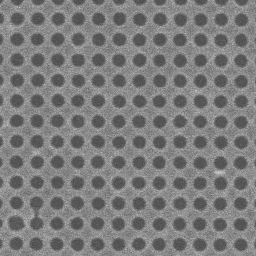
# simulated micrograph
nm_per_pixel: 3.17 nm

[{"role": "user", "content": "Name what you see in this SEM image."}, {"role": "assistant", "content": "a regular array of holes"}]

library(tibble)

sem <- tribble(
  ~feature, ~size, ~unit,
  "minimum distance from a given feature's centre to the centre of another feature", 63.5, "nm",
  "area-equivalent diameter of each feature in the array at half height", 43.8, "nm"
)